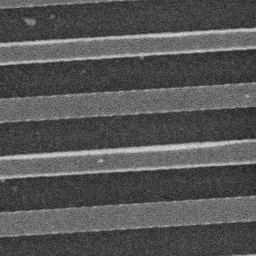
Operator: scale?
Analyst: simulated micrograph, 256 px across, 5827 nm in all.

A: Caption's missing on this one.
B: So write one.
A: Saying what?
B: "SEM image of lines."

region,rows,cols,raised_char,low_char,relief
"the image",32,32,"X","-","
XXXXXXX-------------------------
--------------------------------
--------------------------------
--------------------------------
-----------------XXXXXXXXXXXXXXX
-XXXXXXXXXXXXXXXXXXXXXXXXXXXXXXX
XXXXXXXXXXXXXXXXXXXXXXXX--------
XXXXXXXXXX----------------------
--------------------------------
--------------------------------
------------------------------XX
--------------XXXXXXXXXXXXXXXXXX
XXXXXXXXXXXXXXXXXXXXXXXXXXXXXXXX
XXXXXXXXXXXXXXXXXXXXXXXXXXXX----
XXXXXXXXXXXXX-------------------
--------------------------------
--------------------------------
-------------------------------X
-------------------XXXXXXXXXXXXX
---XXXXXXXXXXXXXXXXXXXXXXXXXXXXX
XXXXXXXXXXXXXXXXXXXXXXXXXXXXXX--
XXXXXXXXXXXXXX------------------
--------------------------------
--------------------------------
--------------------------------
------------------XXXXXXXXXXXXXX
--XXXXXXXXXXXXXXXXXXXXXXXXXXXXXX
XXXXXXXXXXXXXXXXXXXXXXXXXXXXXXXX
XXXXXXXXXXXXXXXXXX--------------
X-------------------------------
--------------------------------
--------------------------------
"